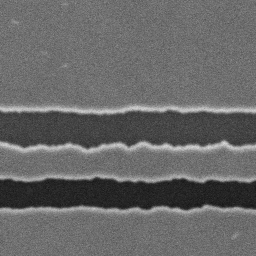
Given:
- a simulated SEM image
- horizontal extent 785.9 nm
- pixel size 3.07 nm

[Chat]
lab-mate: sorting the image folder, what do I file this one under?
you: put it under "lines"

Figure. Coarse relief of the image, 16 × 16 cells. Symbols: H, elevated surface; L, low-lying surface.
HHHHHHHHHHHHHHHH
HHHHHHHHHHHHHHHH
HHHHHHHHHHHHHHHH
HHHHHHHHHHHHHHHH
HHHHHHHHHHHHHHHH
HHHHHHHHHHHHHHHH
HHHHHHHHHHHHHHHH
LLLLLLLLLLLLLLLL
LLLLLLLLLLLLLLLL
HHHHHHHHHHHHHHHH
HHHHHHHHHHHHHHHH
LLLLLLLLLLLLLLLL
LLLLLLLLLLLLLLLL
HHHHHHHHHHHHHHHH
HHHHHHHHHHHHHHHH
HHHHHHHHHHHHHHHH